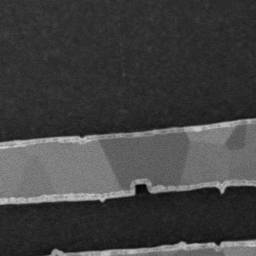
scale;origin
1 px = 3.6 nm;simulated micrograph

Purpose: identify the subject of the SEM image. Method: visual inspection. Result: one or a few lines or trenches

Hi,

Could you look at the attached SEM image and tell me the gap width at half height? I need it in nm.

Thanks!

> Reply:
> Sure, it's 196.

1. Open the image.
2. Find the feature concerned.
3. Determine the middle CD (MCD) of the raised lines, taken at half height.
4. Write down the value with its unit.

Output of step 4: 224 nanometres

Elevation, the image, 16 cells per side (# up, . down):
................
................
................
................
................
................
................
................
......##########
################
################
################
#####...........
................
................
..........######